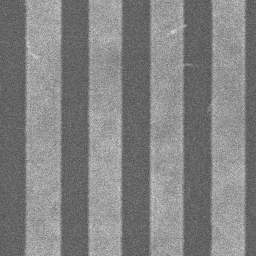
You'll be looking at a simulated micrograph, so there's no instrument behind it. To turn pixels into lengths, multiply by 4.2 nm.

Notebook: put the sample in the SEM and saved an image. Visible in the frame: one or a few lines or trenches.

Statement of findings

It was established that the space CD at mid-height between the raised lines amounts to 130 nm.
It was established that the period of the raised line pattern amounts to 0.259 um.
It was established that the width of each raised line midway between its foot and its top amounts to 130 nm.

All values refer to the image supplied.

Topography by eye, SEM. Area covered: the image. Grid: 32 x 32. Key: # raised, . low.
...####....####....####....###..
...####....####....####....###..
...####....####....####....###..
...####....####....####....###..
...####....####....####....###..
...####....####....####....####.
...####....####....####....####.
...####....####....####....####.
...####....####....####....####.
...####....####....####....####.
...####....####....####....###..
...####....####....####....###..
...####....####....####....###..
...####....####....####....####.
...####....####....####....###..
...####....####....####....###..
...####....####....####....###..
...####....####....####....###..
...####....####....####....###..
...####....####....####....###..
...####....####....####....###..
...####....####....####....###..
...####....####....####....###..
...####....####....####....###..
...####....####....####....###..
...####....####....####....###..
...####....####....####....###..
...####....####....####....###..
...####....####....####....###..
...####....####....####....###..
...####....####....####....###..
...####....####....####....###..